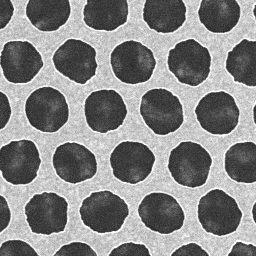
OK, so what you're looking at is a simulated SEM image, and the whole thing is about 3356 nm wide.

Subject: a regular array of holes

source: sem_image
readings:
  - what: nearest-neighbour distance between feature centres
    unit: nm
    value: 742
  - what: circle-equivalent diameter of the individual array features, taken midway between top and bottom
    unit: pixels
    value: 44.4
